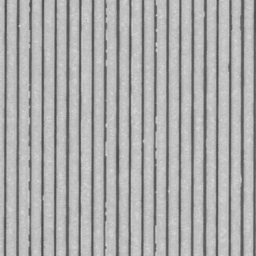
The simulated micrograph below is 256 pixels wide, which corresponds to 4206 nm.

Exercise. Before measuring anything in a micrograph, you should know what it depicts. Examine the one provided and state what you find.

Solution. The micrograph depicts parallel lines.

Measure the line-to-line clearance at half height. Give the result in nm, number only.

43.1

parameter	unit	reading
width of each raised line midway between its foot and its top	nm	154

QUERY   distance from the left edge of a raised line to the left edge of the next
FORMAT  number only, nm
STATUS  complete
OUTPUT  205